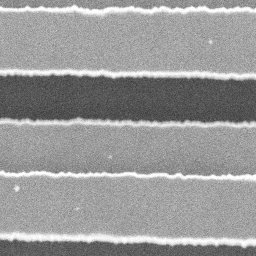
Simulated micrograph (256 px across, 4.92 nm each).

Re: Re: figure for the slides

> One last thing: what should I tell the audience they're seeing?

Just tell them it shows lines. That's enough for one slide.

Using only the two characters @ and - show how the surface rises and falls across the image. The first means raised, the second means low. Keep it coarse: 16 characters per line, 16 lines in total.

@@@@@@@@@@@@@@@@
@@@@@@@@@@@@@@@@
@@@@@@@@@@@@@@@@
@@@@@@@@@@@@@@@@
@@@@@@@@@@@@@@@@
----------------
----------------
----------------
@@@@@@@@@@@@@@@@
@@@@@@@@@@@@@@@@
@@@@@@@@@@@@@@@@
@@@@@@@@@@@@@@@@
@@@@@@@@@@@@@@@@
@@@@@@@@@@@@@@@@
@@@@@@@@@@@@@@@@
----------------